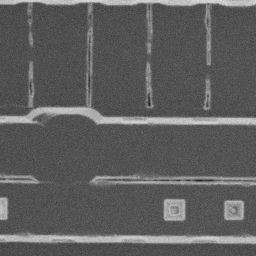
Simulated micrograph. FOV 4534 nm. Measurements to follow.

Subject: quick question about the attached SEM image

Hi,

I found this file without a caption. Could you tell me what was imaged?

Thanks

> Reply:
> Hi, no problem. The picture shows wiring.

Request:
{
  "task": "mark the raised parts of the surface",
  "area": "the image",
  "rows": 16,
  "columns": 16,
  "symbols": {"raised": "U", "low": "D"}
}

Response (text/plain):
DDDDDDDDDDDDDDDD
DDDDDDDDDDDDDDDD
DDDDDDDDDDDDDDDD
DDDDDDDDDDDDDDDD
DDDDDDDDDDDDDDDD
DDDDDDDDDDDDDDDD
DDDDDDDDDDDDDDDD
DUUUUUDDDDDDDDDD
UUUUUUUUUUUUUUUU
UUUUUUUUUUUUUUUU
UUUUUUUUUUUUUUUU
UUUUUUUUUUUUUUUU
UUUUUUUUUUUUUUUU
UUUUUUUUUUUUUUUU
UUUUUUUUUUUUUUUU
DDDDDDDDDDDDDDDD